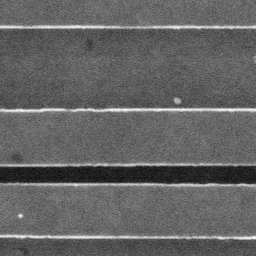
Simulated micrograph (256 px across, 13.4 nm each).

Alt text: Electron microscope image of lines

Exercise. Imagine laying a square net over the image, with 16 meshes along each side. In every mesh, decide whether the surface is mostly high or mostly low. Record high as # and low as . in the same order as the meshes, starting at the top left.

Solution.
################
################
................
................
................
................
................
################
################
################
................
................
################
################
################
................